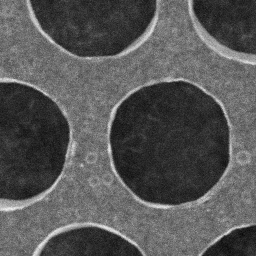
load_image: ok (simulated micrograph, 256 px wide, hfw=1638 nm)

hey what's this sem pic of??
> holes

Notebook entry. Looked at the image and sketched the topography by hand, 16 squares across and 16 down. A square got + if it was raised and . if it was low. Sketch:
++........++....
++........++....
+++......++++...
+++++..+++++++..
++++++++++++++++
..+++++++...++++
....++++......++
....+++.......++
....+++.......++
....+++.......++
....+++.......++
...+++++.....+++
..+++++++...++++
++++++++++++++++
++++...+++++++..
+++......++++...